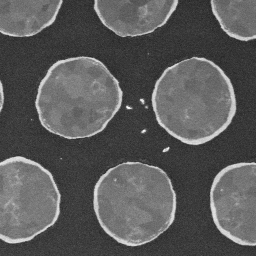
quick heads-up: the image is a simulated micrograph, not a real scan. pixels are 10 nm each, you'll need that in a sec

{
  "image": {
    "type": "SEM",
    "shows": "raised bodies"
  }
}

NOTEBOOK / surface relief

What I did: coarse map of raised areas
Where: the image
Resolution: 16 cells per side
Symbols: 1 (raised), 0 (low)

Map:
1111001111100111
1110000111000011
0000000000000000
0000000000000000
0001111000111100
0001111000111100
0011111000111110
0001111000111100
0000100000011000
0000000000000000
1110000111000011
1110001111100111
1111001111100111
1111001111100111
1100000111000011
0000000000000000